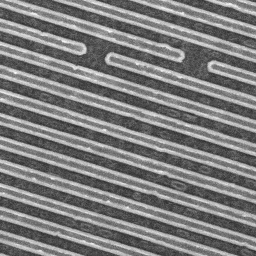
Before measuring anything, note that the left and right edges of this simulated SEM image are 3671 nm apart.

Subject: parallel lines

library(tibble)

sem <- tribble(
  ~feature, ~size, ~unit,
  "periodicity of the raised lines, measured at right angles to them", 322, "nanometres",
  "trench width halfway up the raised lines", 185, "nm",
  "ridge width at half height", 134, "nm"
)